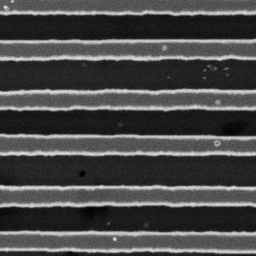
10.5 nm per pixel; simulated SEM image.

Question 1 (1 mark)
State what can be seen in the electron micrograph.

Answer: lines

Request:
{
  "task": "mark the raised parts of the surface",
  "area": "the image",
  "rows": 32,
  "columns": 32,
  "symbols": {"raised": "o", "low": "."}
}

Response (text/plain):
oooooooooooooooooooooooooooooooo
oooooooooooooooooooooooooooooooo
................................
................................
................................
oooooooooooooooooooooooooooooooo
oooooooooooooooooooooooooooooooo
ooooooo....oo...oooo............
................................
................................
................................
.ooooooooooooooooooooooooooooooo
oooooooooooooooooooooooooooooooo
oooooooooooooooooooooooooooooooo
................................
................................
................................
oooooooooooooooooooooooooooooooo
oooooooooooooooooooooooooooooooo
................................
................................
................................
................................
oooooooooooooooooooooooooooooooo
oooooooooooooooooooooooooooooooo
oooooooooooooooooooooooooooooooo
................................
................................
................................
oooooooooooooooooooooooooooooooo
oooooooooooooooooooooooooooooooo
...........oooooo....oo.oooooooo